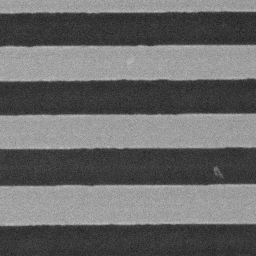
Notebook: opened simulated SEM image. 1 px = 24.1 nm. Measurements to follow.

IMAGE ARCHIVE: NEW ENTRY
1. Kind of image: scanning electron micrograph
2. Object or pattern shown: lines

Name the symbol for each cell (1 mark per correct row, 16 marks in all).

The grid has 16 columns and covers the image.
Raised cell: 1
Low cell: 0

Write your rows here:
1111111111111111
0000000000000000
0000000000000000
1111111111111111
1111111111111111
0000000000000000
0000000000000000
1111111111111111
1111111111111111
0000000000000000
0000000000000000
0000000000000000
1111111111111111
1111111111111111
0000000000000000
0000000000000000